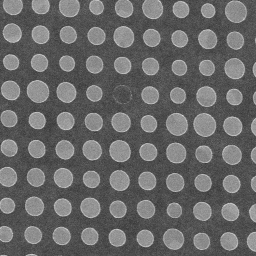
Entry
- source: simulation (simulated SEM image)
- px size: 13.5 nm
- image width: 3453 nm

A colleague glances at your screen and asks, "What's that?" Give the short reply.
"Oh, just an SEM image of a regular array of raised bodies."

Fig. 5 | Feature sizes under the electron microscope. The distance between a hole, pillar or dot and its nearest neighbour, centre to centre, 375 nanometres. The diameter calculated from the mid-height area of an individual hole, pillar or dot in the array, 235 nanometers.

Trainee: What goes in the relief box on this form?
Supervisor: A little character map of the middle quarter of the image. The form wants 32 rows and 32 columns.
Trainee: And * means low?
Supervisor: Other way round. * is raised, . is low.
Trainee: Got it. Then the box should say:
***...****...****...****...****.
**....***....***....****...****.
.....................**.....**..
................................
................................
**..............................
***...***...........***....***..
***...***..........*****...***..
***...***...........****...***..
*...................***.....**..
................................
................................
**....**.....**............**...
**...****...****....**....****..
**...*****..****...****...*****.
**....***...****...****...*****.
.......**....***....***...*****.
...........................***..
................................
*.....**.....**.................
**...****...****....**....****..
**...****..*****...****...****..
**...****...****...****...****..
*.....**....****....***...****..
...........................**...
................................
*...............................
**...***....****...***.....*....
**...****...****...****...****..
**...****...****...****...****..
*.....**....****...****...****..
.............**............**...